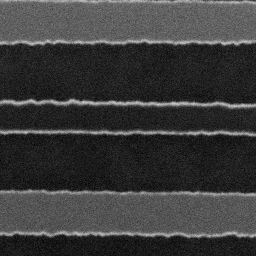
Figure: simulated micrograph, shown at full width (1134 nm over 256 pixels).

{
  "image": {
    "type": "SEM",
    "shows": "lines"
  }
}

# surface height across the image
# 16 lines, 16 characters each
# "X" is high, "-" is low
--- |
XXXXXXXXXXXXXXXX
XXXXXXXXXXXXXXXX
XXXXXXXXXXXXXXXX
----------------
----------------
----------------
XXXXXXXXXXXXXX--
XXXXXXXXXXXXXXXX
----------------
----------------
----------------
----------------
XXXXXXXXXXXXXXXX
XXXXXXXXXXXXXXXX
XXXXXXXXXXXXXXXX
----------------